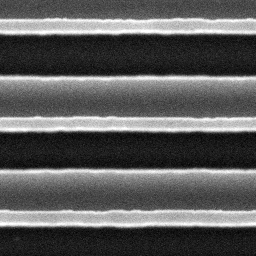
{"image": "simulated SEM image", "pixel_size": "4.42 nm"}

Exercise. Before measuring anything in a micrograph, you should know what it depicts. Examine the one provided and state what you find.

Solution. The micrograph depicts lines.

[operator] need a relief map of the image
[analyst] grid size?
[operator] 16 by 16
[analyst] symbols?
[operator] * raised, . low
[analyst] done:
****************
****************
................
................
................
****************
****************
****************
................
................
................
****************
****************
****************
................
................